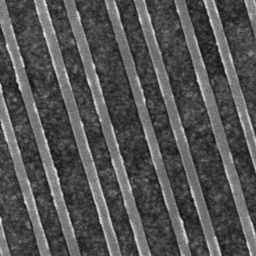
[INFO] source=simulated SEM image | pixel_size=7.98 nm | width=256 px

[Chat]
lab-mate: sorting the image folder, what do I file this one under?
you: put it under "parallel lines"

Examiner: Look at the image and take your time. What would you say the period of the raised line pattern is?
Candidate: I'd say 265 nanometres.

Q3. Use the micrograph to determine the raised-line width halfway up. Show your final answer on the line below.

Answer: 79.3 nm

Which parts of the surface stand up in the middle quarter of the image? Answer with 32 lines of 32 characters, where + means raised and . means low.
.....+++.......+++....+++.......
.....+++......++++.....++.......
+.....++........++.....+++......
+.....+++.......+++....+++......
+.....+++........++.....++......
++....+++........++.....+++.....
++.....++........+++....+++.....
++.....+++.......+++.....++.....
+++....+++........++.....++.....
+++.....++........++.+...+++....
+++.....++........++++...+++....
.++.....+++.......+++.....++....
.+++....+++........++.....+++...
++++.....++........++.....+++...
..++.....+++.......+++.....++...
..+++....+++........++.....+++..
..+++.....++........++.....+++..
...++.....+++.......+++..+..++..
...+++....+++........++.....+++.
...+++.....++........++.....+++.
...+++.....+++.......+++....+++.
....++.....+++.......+++.....++.
....+++.....++........++.....+++
....+++.....+++.......++.....+++
.....++.....+++.......+++.....++
.....+++....+++........++.....++
.....+++.....++........++.....++
......++.+...+++.......+++.....+
......+++....+++........++.....+
......+++.....++........++.....+
......+++.....+++.......+++....+
.......++.....+++.......+++.....